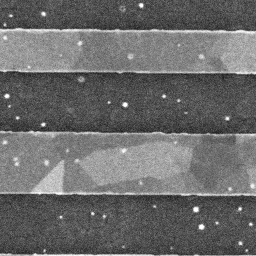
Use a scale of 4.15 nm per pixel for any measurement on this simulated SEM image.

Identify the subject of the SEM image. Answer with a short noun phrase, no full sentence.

lines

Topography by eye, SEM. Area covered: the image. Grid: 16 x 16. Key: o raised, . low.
................
................
oooooooooooooooo
oooooooooooooooo
.......ooooooooo
................
................
................
oooooooooooooooo
oooooooooooooooo
oooooooooooooooo
oooooooooooooooo
................
................
................
................